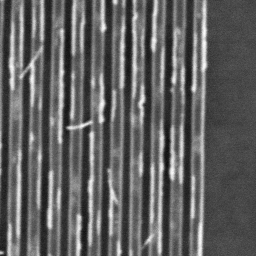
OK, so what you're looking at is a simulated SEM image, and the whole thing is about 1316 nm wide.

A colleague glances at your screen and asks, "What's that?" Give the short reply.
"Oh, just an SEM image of parallel lines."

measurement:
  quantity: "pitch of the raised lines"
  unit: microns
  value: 0.104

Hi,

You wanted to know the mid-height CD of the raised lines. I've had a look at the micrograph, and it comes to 56.5 nm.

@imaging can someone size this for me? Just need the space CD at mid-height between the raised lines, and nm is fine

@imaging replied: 46.9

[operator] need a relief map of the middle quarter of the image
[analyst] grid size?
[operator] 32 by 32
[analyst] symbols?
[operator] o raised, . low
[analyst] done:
..oo...oo...ooo..ooo..ooo..ooo..
..ooo..oo...ooo..ooo..ooo..ooo..
..oo...oo...ooo..ooo..ooo..ooo..
..oo...oo...ooo..ooo..ooo..ooo..
..oo...ooo..ooo..ooo..ooo..ooo..
..oo...ooo..ooo..ooo..ooo..ooo..
..oo...ooo..oo...ooo..ooo..ooo..
..oo...ooo..oo...ooo..ooo..ooo..
..ooo..ooo..oo...ooo..ooo..ooo..
..ooo..ooo..ooo..ooo..ooo..ooo..
..oo...ooo..ooo..ooo..ooo..ooo..
..oo...ooo..ooo..ooo..ooo..ooo..
..oo...ooo..ooo..ooo..ooo..ooo..
..oo...ooo..oo...ooo..ooo..ooo..
..oo..oooo..oo...ooo..ooo..ooo..
..ooo..oo...oo...oo...ooo..ooo..
..oo...oo...oo...oo...ooo..ooo..
..oo..ooo...oo...oo...ooo..ooo..
..oo...oo...oo...oo...ooo..ooo..
..oo...oo...oo...oo...ooo..ooo..
..oo...oo...oo...oo...ooo..ooo..
..oo...oo...oo...oo...ooo..ooo..
..oo...oo...oo...oo...ooo..ooo..
..oo...oo...oo...oo...ooo..ooo..
..oo...oo...oo...ooo..ooo..oo...
..oo...oo...oo...ooo..ooo..ooo..
..oo...oo...oo...ooo..ooo.oooo..
..oo...oo...oo...oo...ooo.oooo..
..oo..ooo...oo...oo...ooo..ooo..
..oo..ooo..ooo...oo...oo...ooo..
..oo..ooo..ooo...oo...oo...oo...
..oo..ooo...oo...oo...oo...oo...